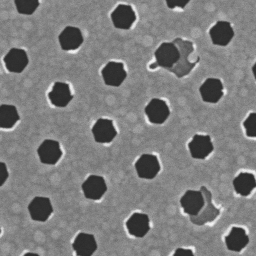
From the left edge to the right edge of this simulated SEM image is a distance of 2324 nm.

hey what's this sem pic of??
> a regular array of holes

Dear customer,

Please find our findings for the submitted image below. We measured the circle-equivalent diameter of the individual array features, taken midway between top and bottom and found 0.222 µm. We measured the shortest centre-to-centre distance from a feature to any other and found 510 nanometers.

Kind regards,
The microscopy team